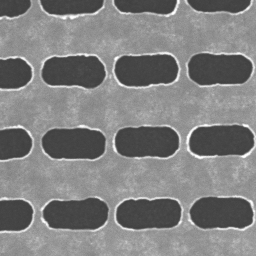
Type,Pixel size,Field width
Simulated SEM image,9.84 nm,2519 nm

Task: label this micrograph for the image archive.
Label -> a regular array of holes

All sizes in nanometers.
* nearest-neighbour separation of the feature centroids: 706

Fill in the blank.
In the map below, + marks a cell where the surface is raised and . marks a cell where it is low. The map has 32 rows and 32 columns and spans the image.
....+........+........++.......+
...+++......+++.......++++.++.++
++++++++++++++++++++++++++++++++
++++++++++++++++++++++++++++++++
++++++++++++++++++++++++++++++++
++++++++++++++++++++++++++++++++
++++++++++++++++++++++++++++++++
...+++......+++.......++.......+
....+........+........+.........
....+........++.......++.......+
...+++......+++.....+++++.....++
++++++++++++++++++++++++++++++++
++++++++++++++++++++++++++++++++
++++++++++++++++++++++++++++++++
++++++++++++++++++++++++++++++++
++++++++++++++++++++++++++++++++
...+++......+++.......++........
....+........+........++........
....+........++.......++........
...+++.......+++.....+++++++++++
++++++++++++++++++++++++++++++++
++++++++++++++++++++++++++++++++
++++++++++++++++++++++++++++++++
++++++++++++++++++++++++++++++++
++++++++++++++++++++++++++++++++
....++.......++.......++.......+
....+.........+........+........
....++.......++........+........
...++++.....++++...++++++...++++
++++++++++++++++++++++++++++++++
++++++++++++++++++++++++++++++++
++++++++++++++++++++++++++++++++